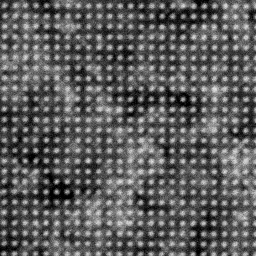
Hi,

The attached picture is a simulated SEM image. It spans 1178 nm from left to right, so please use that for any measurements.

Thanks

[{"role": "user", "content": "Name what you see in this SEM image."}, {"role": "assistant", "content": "a regular array of raised bodies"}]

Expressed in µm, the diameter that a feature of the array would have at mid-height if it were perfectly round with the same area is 0.0208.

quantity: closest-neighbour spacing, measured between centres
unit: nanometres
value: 46.4